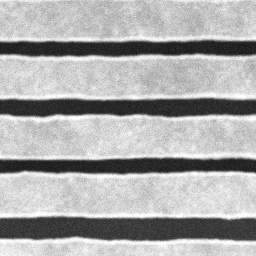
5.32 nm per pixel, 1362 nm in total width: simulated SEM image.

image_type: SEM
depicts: lines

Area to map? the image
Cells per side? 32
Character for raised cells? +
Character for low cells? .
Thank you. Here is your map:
++++++++++++++++++++++++++++++++
++++++++++++++++++++++++++++++++
++++++++++++++++++++++++++++++++
++++++++++++++++++++++++++++++++
++++++++++++++++++++++++++++++++
................................
................................
++++++++++++++++++++++++++++++++
++++++++++++++++++++++++++++++++
++++++++++++++++++++++++++++++++
++++++++++++++++++++++++++++++++
++++++++++++++++++++++++++++++++
................................
................................
++....+++++++++++++.......++++++
++++++++++++++++++++++++++++++++
++++++++++++++++++++++++++++++++
++++++++++++++++++++++++++++++++
++++++++++++++++++++++++++++++++
++++++++++++++++++++++++++++++++
................................
...++...................+.+++...
++++++++++++++++++++++++++++++++
++++++++++++++++++++++++++++++++
++++++++++++++++++++++++++++++++
++++++++++++++++++++++++++++++++
++++++++++++++++++++++++++++++++
................................
................................
................................
++++++++++++++++++++++++++++++++
++++++++++++++++++++++++++++++++